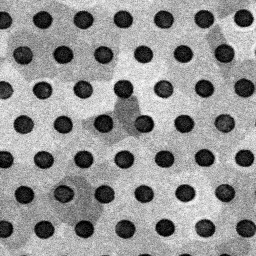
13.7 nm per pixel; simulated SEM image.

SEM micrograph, a regular array of holes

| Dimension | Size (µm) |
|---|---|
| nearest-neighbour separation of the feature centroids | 0.545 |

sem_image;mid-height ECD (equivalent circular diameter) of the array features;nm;267